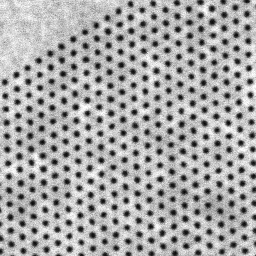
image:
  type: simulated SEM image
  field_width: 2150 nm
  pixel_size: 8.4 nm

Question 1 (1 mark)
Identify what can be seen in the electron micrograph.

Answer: a regular array of holes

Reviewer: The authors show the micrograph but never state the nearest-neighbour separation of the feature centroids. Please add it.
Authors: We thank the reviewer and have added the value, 13.2 px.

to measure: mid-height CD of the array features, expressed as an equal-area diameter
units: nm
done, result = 51.9